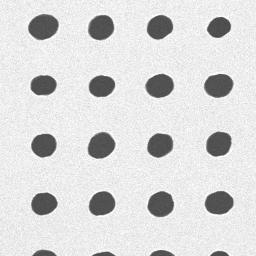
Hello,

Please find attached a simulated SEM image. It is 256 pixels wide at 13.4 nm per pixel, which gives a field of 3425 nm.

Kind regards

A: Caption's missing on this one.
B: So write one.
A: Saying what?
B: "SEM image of a regular array of holes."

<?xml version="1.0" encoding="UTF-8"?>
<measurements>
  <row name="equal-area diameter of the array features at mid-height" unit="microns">0.336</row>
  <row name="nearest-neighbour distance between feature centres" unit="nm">778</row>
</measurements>